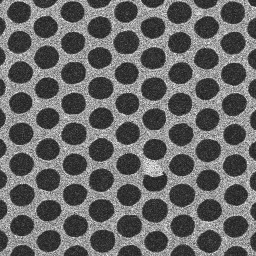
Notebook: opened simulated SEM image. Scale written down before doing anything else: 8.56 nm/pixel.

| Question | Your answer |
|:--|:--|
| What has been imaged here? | a regular array of holes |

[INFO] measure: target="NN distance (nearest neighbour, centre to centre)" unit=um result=0.258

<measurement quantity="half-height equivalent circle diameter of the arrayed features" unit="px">23.3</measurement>